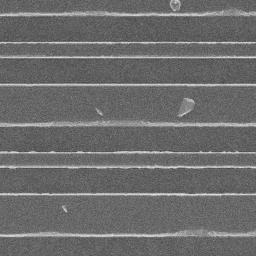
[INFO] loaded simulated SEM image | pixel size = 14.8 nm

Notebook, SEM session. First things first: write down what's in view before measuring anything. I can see lines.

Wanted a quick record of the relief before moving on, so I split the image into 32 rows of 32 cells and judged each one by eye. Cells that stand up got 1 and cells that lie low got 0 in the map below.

11111111111111111111111111111111
11111111111111111111111111111111
00000000000000000000000000000000
00000000000000000000000000000000
00000000000000000000000000000000
11111111111111111111111111111111
11111111111111111111111111111111
00000000000000000000000000000000
00000000000000000000000000000000
00000000000000000000000000000000
00000000000000000000000000000000
11111111111111111111111111111111
11111111111111111111111111111111
11111111111111111111111111111111
11111111111111111111111111111111
11111111111111111111111111111111
00000000000000000000000000000000
00000000000000000000000000000000
00000000000000000000000000000000
11111111111111111111111111111111
11111111111111111111111111111111
00000000000000000000000000000000
00000000000000000000000000000000
00000000000000000000000000000000
11111111111111111111111111111111
11111111111111111111111111111111
11111111111111111111111111111111
11111111111111111111111111111111
11111111111111111111111111111111
00000000000000000000000000000000
00000000000000000000000000000000
00000000000000000000000000000000